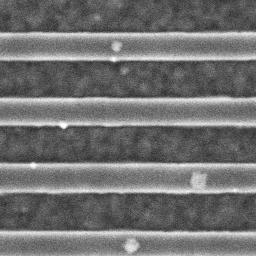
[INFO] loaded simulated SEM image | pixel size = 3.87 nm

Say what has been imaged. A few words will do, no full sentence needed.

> lines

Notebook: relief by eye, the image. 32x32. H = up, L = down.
LLLLLLLLLLLLLLLLLLLLLLLLLLLLLLLL
LLLLLLLLLLLLLLLLLLLLLLLLLLLLLLLL
LLLLLLLLLLLLLLLLLLLLLLLLLLLLLLLL
LLLLLLLLLLLLLLLLLLLLLLLLLLLLLLLL
HHHHHHHHHHHHHHHHHHHHHHHHHHHHHHHH
HHHHHHHHHHHHHHHHHHHHHHHHHHHHHHHH
HHHHHHHHHHHHHHHHHHHHHHHHHHHHHHHH
LLLLLLLLLLLLLLHLLLLLLLLLLLLLLLLL
LLLLLLLLLLLLLLLLLLLLLLLLLLLLLLLL
LLLLLLLLLLLLLLLLLLLLLLLLLLLLLLLL
LLLLLLLLLLLLLLLLLLLLLLLLLLLLLLLL
LLLLLLLLLLLLLLLLLLLLLLLLLLLLLLLL
HHHHHHHHHHHHHHHHHHHHHHHHHHHHHHHH
HHHHHHHHHHHHHHHHHHHHHHHHHHHHHHHH
HHHHHHHHHHHHHHHHHHHHHHHHHHHHHHHH
HHHHHHHHHHHHHHHHHHHHHHHHHHHHHHHH
LLLLLLLLLLLLLLLLLLLLLLLLLLLLLLLL
LLLLLLLLLLLLLLLLLLLLLLLLLLLLLLLL
LLLLLLLLLLLLLLLLLLLLLLLLLLLLLLLL
LLLLLLLLLLLLLLLLLLLLLLLLLLLLLLLL
LLLLHLLLLLLLLLLLLLLLLLLLLLLLLLLL
HHHHHHHHHHHHHHHHHHHHHHHHHHHHHHHH
HHHHHHHHHHHHHHHHHHHHHHHHHHHHHHHH
HHHHHHHHHHHHHHHHHHHHHHHHHHHHHHHH
LLLLLLLLLLLLLLLLLLLLLLLLLLLLLLLL
LLLLLLLLLLLLLLLLLLLLLLLLLLLLLLLL
LLLLLLLLLLLLLLLLLLLLLLLLLLLLLLLL
LLLLLLLLLLLLLLLLLLLLLLLLLLLLLLLL
LLLLLLLLLLLLLLLLLLLLLLLLLLLLLLLL
HHHHHHHHHHHHHHHHHHHHHHHHHHHHHHHH
HHHHHHHHHHHHHHHHHHHHHHHHHHHHHHHH
HHHHHHHHHHHHHHHHHHHHHHHHHHHHHHHH